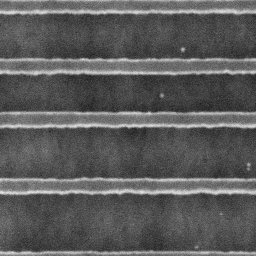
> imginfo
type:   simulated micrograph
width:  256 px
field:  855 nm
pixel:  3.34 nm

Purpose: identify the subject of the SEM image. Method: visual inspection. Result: lines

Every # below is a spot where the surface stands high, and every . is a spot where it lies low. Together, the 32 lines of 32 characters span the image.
################################
################################
................................
................................
................................
................................
................................
################################
################################
................................
................................
................................
................................
................................
################################
################################
................................
................................
................................
................................
................................
................................
#######..#######################
################################
................................
................................
................................
................................
................................
................................
................................
...........#......#.............